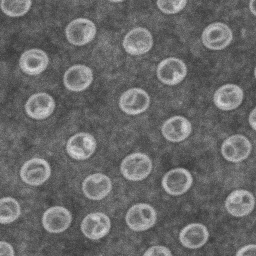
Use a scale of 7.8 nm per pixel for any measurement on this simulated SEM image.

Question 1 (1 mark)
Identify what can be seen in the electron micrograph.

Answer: a regular array of raised bodies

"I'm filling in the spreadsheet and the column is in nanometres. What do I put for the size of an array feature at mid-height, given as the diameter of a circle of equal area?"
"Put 203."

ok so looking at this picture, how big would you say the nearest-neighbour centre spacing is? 354 nanometres